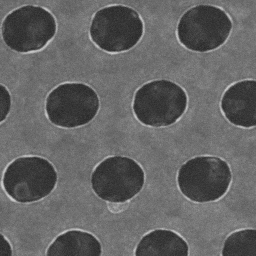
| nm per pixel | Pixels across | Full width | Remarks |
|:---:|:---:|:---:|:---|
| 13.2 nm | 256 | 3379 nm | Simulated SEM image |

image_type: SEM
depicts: a regular array of holes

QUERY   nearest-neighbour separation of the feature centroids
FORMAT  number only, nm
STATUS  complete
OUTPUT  1140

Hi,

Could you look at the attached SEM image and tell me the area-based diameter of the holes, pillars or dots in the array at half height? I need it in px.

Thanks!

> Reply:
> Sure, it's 50.8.